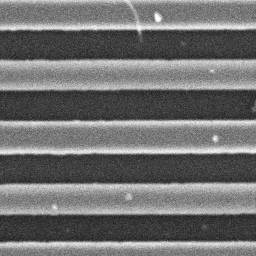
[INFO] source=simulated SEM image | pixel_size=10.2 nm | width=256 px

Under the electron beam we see lines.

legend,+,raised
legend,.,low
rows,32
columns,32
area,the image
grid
++++++++++++++++++++++++++++++++
++++++++++++++++++++++++++++++++
++++++++++++++++++++++++++++++++
++++++++++++++++++++++++++++++++
................................
................................
................................
................................
++++++++++++++++++++++++++++++++
++++++++++++++++++++++++++++++++
++++++++++++++++++++++++++++++++
................................
................................
................................
................................
++++++++++++++++++++++++++++++++
++++++++++++++++++++++++++++++++
++++++++++++++++++++++++++++++++
++++++++++++++++++++++++++++++++
................................
................................
................................
................................
++++++++++++++++++++++++++++++++
++++++++++++++++++++++++++++++++
++++++++++++++++++++++++++++++++
++++++++++++++++++++++++++++++++
................................
................................
................................
++++++++++++++++++++++++++++++++
++++++++++++++++++++++++++++++++